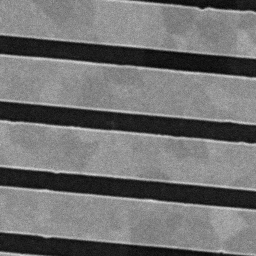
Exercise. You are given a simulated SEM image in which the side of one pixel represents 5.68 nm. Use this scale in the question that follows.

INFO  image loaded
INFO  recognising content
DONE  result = one or a few lines or trenches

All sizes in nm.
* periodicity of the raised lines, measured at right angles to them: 372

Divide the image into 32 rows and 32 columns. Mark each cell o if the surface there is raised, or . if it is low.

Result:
oooooooooooooooooooo............
oooooooooooooooooooooooooooooooo
oooooooooooooooooooooooooooooooo
oooooooooooooooooooooooooooooooo
...ooooooooooooooooooooooooooooo
.............ooooooooooooooooooo
........................oooooooo
ooooooo.........................
oooooooooooooooooo..............
oooooooooooooooooooooooooooo....
oooooooooooooooooooooooooooooooo
oooooooooooooooooooooooooooooooo
oooooooooooooooooooooooooooooooo
..........oooooooooooooooooooooo
....................oooooooooooo
ooooo..........................o
ooooooooooooooo.................
oooooooooooooooooooooooooo......
oooooooooooooooooooooooooooooooo
oooooooooooooooooooooooooooooooo
oooooooooooooooooooooooooooooooo
.......ooooooooooooooooooooooooo
..................oooooooooooooo
oo...........................ooo
oooooooooooo....................
oooooooooooooooooooooo..........
oooooooooooooooooooooooooooooooo
oooooooooooooooooooooooooooooooo
oooooooooooooooooooooooooooooooo
.....ooooooooooooooooooooooooooo
.................ooooooooooooooo
............................oooo